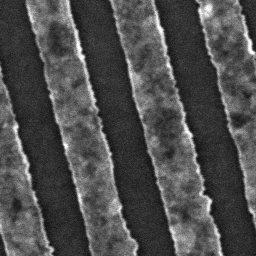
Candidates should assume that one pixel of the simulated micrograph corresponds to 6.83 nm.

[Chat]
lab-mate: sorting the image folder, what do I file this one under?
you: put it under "one or a few lines or trenches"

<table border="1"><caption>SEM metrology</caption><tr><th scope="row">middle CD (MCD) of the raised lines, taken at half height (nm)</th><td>277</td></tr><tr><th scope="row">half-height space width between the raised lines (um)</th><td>0.283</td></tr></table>